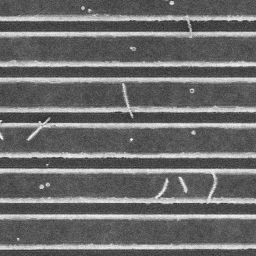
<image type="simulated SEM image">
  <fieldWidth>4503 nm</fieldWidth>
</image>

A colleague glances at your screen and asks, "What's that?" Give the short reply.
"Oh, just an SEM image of lines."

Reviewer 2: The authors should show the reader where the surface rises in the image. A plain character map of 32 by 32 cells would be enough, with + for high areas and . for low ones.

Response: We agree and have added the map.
++++++++++++++++++++++++++++++++
++++++++++++++++++++++++++++++++
.......................+........
................................
++++++++++++++++++++++++++++++++
++++++++++++++++++++++++++++++++
++++++++++++++++++++++++++++++++
++++++++++++++++++++++++++++++++
................................
................................
++++++++++++++++++++++++++++++++
++++++++++++++++++++++++++++++++
++++++++++++++++++++++++++++++++
++++++++++++++++++++++++++++++++
................................
+...++++........................
++++++++++++++++++++++++++++++++
++++++++++++++++++++++++++++++++
++++++++++++++++++++++++++++++++
.................+++............
................................
++++++++++++++++++++++++++++++++
++++++++++++++++++++++++++++++++
++++++++++++++++++++++++++++++++
++++++++++++++++++++++++++++++++
................................
................................
++++++++++++++++++++++++++++++++
++++++++++++++++++++++++++++++++
++++++++++++++++++++++++++++++++
++++++++++++++++++++++++++++++++
................................